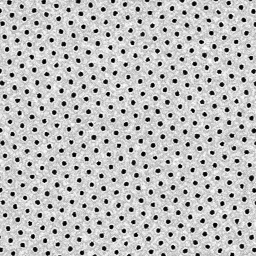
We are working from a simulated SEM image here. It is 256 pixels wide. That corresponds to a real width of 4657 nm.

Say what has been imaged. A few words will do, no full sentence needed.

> a regular array of holes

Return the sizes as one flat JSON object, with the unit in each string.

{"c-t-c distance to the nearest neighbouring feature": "230 nm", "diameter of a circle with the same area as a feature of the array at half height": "0.0918 micrometres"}